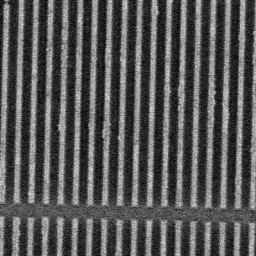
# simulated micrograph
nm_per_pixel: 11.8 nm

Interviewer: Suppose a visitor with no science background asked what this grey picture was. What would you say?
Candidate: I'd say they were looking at parallel lines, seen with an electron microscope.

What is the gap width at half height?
106 nanometers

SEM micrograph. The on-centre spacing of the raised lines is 174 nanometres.